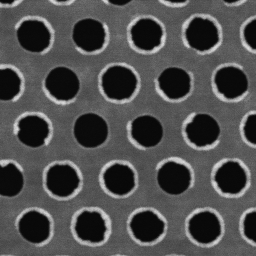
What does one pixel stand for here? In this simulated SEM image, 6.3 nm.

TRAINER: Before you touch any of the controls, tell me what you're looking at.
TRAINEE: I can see a regular array of holes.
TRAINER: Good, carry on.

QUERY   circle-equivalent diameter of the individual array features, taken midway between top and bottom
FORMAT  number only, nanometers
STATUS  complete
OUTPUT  202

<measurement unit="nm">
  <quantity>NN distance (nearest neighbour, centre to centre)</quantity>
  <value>347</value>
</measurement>